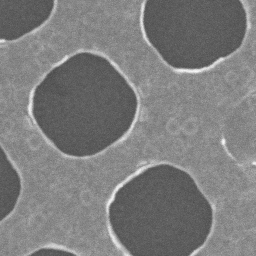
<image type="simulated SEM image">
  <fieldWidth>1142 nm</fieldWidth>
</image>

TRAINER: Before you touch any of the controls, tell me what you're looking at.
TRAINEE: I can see holes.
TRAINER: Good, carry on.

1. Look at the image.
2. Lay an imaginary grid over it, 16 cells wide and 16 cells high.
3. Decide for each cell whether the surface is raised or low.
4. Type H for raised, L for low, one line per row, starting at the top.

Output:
LLLHHHHHHLLLLLLH
LLLHHHHHHLLLLLLH
LHHHHHHHHLLLLLLH
HHHHHLHHHHLLLLHH
HHHLLLLHHHHHHHHH
HHLLLLLLHHHHHHHH
HHLLLLLLLHHHHHHH
HHLLLLLLHHHHHHHH
HHHLLLLLHHHHHHHH
HHHHLLHHHHHHHHHH
LHHHHHHHHLLHHHHH
LHHHHHHHLLLLHHHH
LHHHHHHLLLLLLHHH
HHHHHHHLLLLLLHHH
HHHHHHHLLLLLLHHH
HHHHHHHHLLLLHHHH